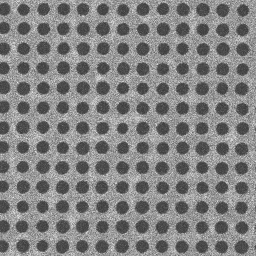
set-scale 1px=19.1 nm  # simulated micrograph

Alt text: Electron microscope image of a regular array of holes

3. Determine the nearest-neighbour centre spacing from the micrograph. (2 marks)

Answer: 19.4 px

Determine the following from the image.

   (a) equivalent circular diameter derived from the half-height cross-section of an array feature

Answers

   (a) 252 nm